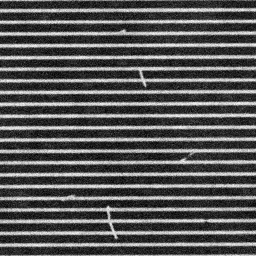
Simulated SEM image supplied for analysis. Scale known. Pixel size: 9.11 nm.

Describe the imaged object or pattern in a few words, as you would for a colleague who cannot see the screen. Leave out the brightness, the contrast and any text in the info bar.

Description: parallel lines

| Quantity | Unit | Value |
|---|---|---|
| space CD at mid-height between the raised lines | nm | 83.2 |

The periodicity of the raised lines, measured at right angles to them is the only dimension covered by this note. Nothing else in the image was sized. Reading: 107 nm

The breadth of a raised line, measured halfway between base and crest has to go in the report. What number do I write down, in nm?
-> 25.1